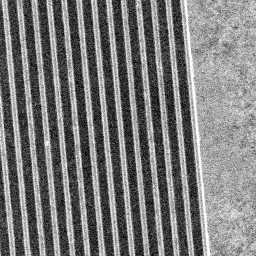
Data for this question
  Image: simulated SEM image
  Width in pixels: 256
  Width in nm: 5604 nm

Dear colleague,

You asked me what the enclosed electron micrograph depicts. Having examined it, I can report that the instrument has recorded parallel lines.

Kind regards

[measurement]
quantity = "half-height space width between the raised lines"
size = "0.234 µm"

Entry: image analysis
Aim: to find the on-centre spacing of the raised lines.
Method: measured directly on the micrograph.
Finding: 324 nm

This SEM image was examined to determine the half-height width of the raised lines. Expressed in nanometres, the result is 106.